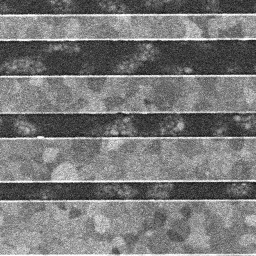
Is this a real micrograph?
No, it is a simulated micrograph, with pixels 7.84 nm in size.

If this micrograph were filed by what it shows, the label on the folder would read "one or a few lines or trenches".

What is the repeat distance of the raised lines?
521 nanometres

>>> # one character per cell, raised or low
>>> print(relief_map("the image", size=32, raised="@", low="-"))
--------------------------------
--------------------------------
@@@@@@@@@@@@@@@@@@@@@@@@@@@@@@@@
@@@@@@@@@@@@@@@@@@@@@@@@@@@@@@@@
@@@@@@@@@@@@@@@@@@@@@@@@@@@@@@@@
--------------------------------
--------------------------------
--------------------------------
--------------------------------
----------------@@@@@@@@@@@@@@@@
@@@@@@@@@@@@@@@@@@@@@@@@@@@@@@@@
@@@@@@@@@@@@@@@@@@@@@@@@@@@@@@@@
@@@@@@@@@@@@@@@@@@@@@@@@@@@@@@@@
@@@@@@@@@@@@@@@@@@@@@@@@@@@@@@@@
--------------------------------
--------------------------------
--------------------------------
@@@@@@@@@@@@@@@@@@@@@@@@@@@@@@@@
@@@@@@@@@@@@@@@@@@@@@@@@@@@@@@@@
@@@@@@@@@@@@@@@@@@@@@@@@@@@@@@@@
@@@@@@@@@@@@@@@@@@@@@@@@@@@@@@@@
@@@@@@@@@@@@@@@@@@@@@@@@@@@@@@@@
@@@@@@@@@@@@@@@@@@@@@@@@@@@@@@@@
--------------------------------
--------------------------------
@@@@@@@@@@@@@@@@@@@@@@@@@@@@@@@@
@@@@@@@@@@@@@@@@@@@@@@@@@@@@@@@@
@@@@@@@@@@@@@@@@@@@@@@@@@@@@@@@@
@@@@@@@@@@@@@@@@@@@@@@@@@@@@@@@@
@@@@@@@@@@@@@@@@@@@@@@@@@@@@@@@@
@@@@@@@@@@@@@@@@@@@@@@@@@@@@@@@@
@@@@@@@@@@@@@@@@@@@@@@@@@@@@@@@@